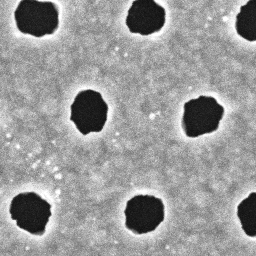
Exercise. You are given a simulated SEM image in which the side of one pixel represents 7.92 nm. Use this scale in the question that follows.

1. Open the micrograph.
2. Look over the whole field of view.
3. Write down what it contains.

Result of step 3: holes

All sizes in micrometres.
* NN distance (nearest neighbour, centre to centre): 0.895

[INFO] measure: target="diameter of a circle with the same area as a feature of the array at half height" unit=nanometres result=330